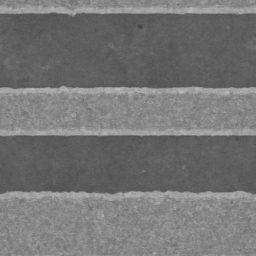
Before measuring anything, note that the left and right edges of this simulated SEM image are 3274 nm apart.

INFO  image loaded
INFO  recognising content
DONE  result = one or a few lines or trenches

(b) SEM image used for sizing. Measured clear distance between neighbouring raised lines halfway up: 917 nm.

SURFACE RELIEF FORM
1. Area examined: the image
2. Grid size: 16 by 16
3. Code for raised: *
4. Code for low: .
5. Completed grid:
****************
................
................
................
................
................
****************
****************
................
................
................
................
****************
****************
****************
****************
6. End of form